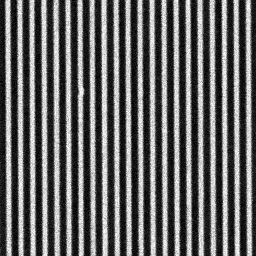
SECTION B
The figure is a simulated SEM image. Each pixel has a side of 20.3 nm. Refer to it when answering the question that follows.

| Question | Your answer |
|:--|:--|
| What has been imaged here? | parallel lines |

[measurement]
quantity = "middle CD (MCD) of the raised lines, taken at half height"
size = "96.5 nanometers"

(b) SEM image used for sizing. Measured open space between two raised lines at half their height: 135 nm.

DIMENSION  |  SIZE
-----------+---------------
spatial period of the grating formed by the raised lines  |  0.244 microns